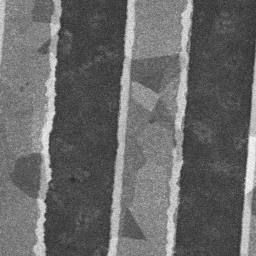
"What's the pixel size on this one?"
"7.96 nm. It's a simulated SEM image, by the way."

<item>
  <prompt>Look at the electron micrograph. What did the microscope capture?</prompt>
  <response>one or a few lines or trenches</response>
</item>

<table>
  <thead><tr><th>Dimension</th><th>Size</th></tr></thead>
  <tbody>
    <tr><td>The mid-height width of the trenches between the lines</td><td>583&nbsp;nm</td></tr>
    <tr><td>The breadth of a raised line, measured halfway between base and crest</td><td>455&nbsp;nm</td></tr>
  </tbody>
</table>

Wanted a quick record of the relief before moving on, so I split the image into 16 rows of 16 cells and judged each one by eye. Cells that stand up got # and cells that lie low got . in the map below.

####....####....
###.....####....
###.....####....
###.....####....
###.....####....
###.....###.....
###.....###.....
###.....###.....
###.....###.....
###.....###.....
###....####.....
###....####.....
###....####....#
###....####....#
###....####....#
##.....####....#